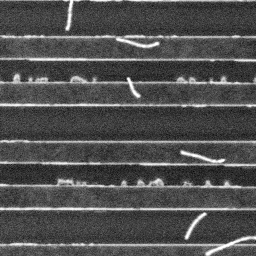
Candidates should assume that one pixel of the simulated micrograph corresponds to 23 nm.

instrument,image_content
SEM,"lines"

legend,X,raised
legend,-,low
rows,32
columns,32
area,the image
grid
--------------------------------
--------------------------------
--------------------------------
--------------------------------
--------------------------------
XXXXXXXXXXXXXXXXXXXXXXXXXXXXXXXX
XXXXXXXXXXXXXXXXXXXXXXXXXXXXXXXX
-----------------------------XXX
--------------------------------
--------------------------------
XXXXXXXXXXXXXXXXXXXXXXXXXXXXXXXX
XXXXXXXXXXXXXXXXXXXXXXXXXXXXXXXX
XXXXXXXXXXXXXXXXXXXXXXXXXXXXXXXX
--------------------------------
--------------------------------
--------------------------------
--------------------------------
--------------------------------
XXXXXXXXXXXXXXXXXXXXXXXXXXXXXXXX
XXXXXXXXXXXXXXXXXXXXXXXXXXXXXXXX
-----------------XXXXXXXXXXXXXXX
--------------------------------
--------------------------------
XXXXXXXXXXXXXXXXXXXXXXXXXXXXXXXX
XXXXXXXXXXXXXXXXXXXXXXXXXXXXXXXX
XXXXXXXXXXXXXXXXXXXXXXXXXXXXXXXX
--------------------------------
--------------------------------
--------------------------------
--------------------------------
--------------------------------
XXXXXXXXXXXXXXXXXXXXXXXXXXXXXXXX